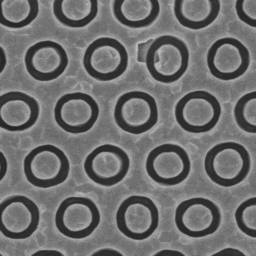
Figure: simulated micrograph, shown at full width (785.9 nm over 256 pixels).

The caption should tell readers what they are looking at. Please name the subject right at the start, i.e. a regular array of ring-shaped grooves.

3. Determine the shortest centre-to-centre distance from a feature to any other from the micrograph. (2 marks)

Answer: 182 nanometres